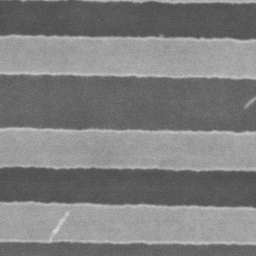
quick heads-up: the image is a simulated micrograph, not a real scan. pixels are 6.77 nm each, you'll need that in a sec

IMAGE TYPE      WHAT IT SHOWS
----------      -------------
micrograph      lines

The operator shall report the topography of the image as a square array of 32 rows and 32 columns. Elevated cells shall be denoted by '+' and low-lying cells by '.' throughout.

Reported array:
................................
................................
................................
................................
+++++++.+.......................
++++++++++++++++++++++++++++++++
++++++++++++++++++++++++++++++++
++++++++++++++++++++++++++++++++
++++++++++++++++++++++++++++++++
.................+++++++++++++++
................................
................................
................................
................................
................................
................................
+++++++++++++++++++++++++++++.++
++++++++++++++++++++++++++++++++
++++++++++++++++++++++++++++++++
++++++++++++++++++++++++++++++++
++++++++++++++++++++++++++++++++
................................
................................
................................
................................
++++++++++++....................
++++++++++++++++++++++++++++++++
++++++++++++++++++++++++++++++++
++++++++++++++++++++++++++++++++
++++++++++++++++++++++++++++++++
.......................+++..++++
................................